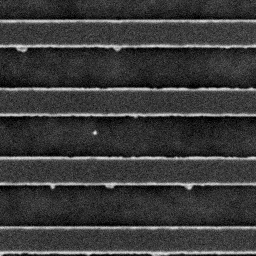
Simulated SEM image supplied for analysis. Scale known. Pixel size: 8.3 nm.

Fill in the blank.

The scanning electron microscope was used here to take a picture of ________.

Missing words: lines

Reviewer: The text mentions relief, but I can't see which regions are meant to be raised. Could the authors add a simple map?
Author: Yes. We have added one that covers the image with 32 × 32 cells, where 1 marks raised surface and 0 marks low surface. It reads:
00000000000000000000000000000000
00000000000000000000000000000000
00000000000000000000000000000000
11111111111111111111111111111111
11111111111111111111111111111111
11111111111111111111111111111111
00000000000000000000000000000000
00000000000000000000000000000000
00000000000000000000000000000000
00000000000000000000000000000000
00000000000000000000000000000000
11111111111111111111111111111111
11111111111111111111111111111111
11111111111111111111111111111111
00000000000000000000000000000000
00000000000000000000000000000000
00000000000000000000000000000000
00000000000000000000000000000000
00000000000000000000000000000000
00000000000000000000000000000000
11111111111111111111111111111111
11111111111111111111111111111111
11111111111111111111111111111111
00000000000000000000000000000000
00000000000000000000000000000000
00000000000000000000000000000000
00000000000000000000000000000000
00000000000000000000000000000000
11111111111111111111111111111111
11111111111111111111111111111111
11111111111111111111111111111111
11111111111111111111111111111111